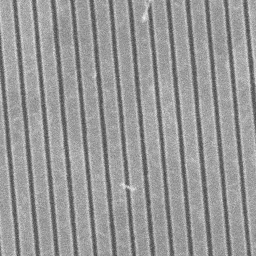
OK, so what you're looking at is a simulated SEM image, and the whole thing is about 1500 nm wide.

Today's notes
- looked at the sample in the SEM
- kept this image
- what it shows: parallel lines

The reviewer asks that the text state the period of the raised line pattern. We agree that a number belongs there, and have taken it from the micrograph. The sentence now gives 112 nm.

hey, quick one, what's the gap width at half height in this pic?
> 0.0343 micrometres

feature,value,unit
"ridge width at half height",78.1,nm